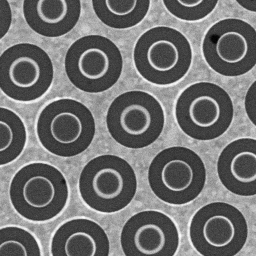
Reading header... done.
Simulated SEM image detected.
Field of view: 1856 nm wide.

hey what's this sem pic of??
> an array of small figures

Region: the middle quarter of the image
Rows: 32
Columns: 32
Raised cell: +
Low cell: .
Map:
....+++++++....+++....+++++.....
....++++++.....+++.............+
+....+++++....+++++............+
+.............++++++..........++
++...........++++++++.......++++
+++.........++++++++++++.++++++.
++++.......+++++++++++++++++++..
++++++++++++++........+++++++...
.++++++++++++..........+++++....
....++++++++............++++....
.....++++++..............+++....
......+++++.....++++.....+++....
+......++++....++++++....+++....
+++....+++.....++++++....+++....
++++....++.....++++++....+++....
++++....+++....++++++....++++...
++++....+++.....++++.....++++...
++++....+++.............++++++..
+++....+++++...........+++++++++
++.....++++++..........+++++++++
......+++++++++......++++++.++++
.....++++++++++++++++++++.......
....+++++++++++++++++++.........
+++++++........++++++++.........
++++++..........++++++.....+++..
+++++............++++....++++++.
+++++............++++....+++++++
++++.....++++.....+++....+++++++
++++....++++++....+++....+++++++
.+++....++++++....+++....+++++++
.++.....++++++....++++....+++++.
.+++....++++++....++++..........